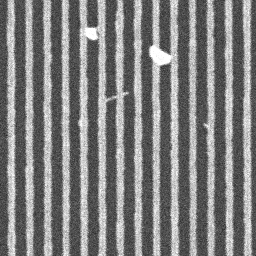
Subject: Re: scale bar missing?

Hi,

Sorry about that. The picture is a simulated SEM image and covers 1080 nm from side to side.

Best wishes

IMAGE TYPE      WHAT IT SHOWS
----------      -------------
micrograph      parallel lines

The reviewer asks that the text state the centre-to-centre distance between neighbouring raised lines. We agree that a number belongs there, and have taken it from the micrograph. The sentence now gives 0.0766 um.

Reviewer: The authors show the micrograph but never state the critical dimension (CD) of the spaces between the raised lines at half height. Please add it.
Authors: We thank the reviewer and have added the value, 54.3 nm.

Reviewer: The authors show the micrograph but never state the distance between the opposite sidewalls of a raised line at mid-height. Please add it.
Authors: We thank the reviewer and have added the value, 22.1 nanometres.